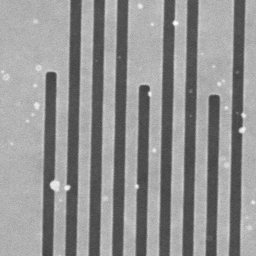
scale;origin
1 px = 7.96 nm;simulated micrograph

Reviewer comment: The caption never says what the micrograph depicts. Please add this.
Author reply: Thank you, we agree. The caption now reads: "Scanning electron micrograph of groups of lines, slits or small figures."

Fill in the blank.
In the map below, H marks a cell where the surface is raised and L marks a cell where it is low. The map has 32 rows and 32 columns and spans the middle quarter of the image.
HLLLHHHLLLHHHLLLHHHHHHHHHLLLHHLL
HLLLHHHLLLHHHLLLHHHHHHHHLLLLHHLL
HLLLHHHLLLHHHLLLHHHHHHHHLLLLHHLL
HLLLHHHLLLHHHLLLHHHHHHHHLLLLHHLL
HLLLHHHLLLHHHLLLHHHHHHHHLLLLHHLL
HLLLHHHLLLHHHLLLHHHLLHHHLLLLHHLL
HLLLHHHLLLHHHLLLHHLLLLHHLLLLHHLL
HLLLHHHLLLHHHLLLHHLLLHHHLLLLHHLL
HLLLHHHLLLHHHLLLHHLLLLHHLLLHHHLL
HLLLHHHLLLHHHLLLHHLLLLHHLLLHHHLL
HLLLHHHLLLHHHLLLHHLLLHHHLLLHHHLL
HLLLHHHLLLHHHLLLHHLLLHHHLLLHHHLL
HLLLHHHLLLHHHLLLHHLLLHHHLLLHHHLL
HLLLHHHLLLHHHLLLHHLLLHHHLLLHHHLL
HLLLHHHLLLHHHLLLHHLLLHHHLLLHHHLL
HLLLHHHLLLHHHLLLHHLLLHHHLLLHHHLL
HLLLHHHLLLHHHLLLHHLLLHHHLLLHHHLL
HLLLHHHLLLHHHLLLHHLLLHHHLLLHHHLL
HLLLHHHLLLHHHLLLHHLLLHHHLLLHHHLL
HLLLHHHLLLHHHLLLHHLLLHHHLLLHHHLL
HLLLHHHLLLHHLLLLHHLLLHHHLLLHHHLL
HLLLHHHLLLHHLLLLHHLLLHHHLLLHHHLL
HLLLHHHLLLHHLLLLHHLLLHHHLLLHHHLL
HLLLHHHLLLHHLLLLHHLLLHHHLLLHHHLL
HLLLHHLLLLHHLLLLHHLLLHHHLLLHHHLL
HLLLHHLLLLHHLLLHHHLLLHHHLLLHHHLL
HLLLHHLLLLHHLLLHHHLLLHHHLLLHHHLL
LLLLHHLLLLHHLLLHHHLLLHHHLLLHHHLL
LLLLHHLLLLHHLLLHHHLLLHHHLLLHHHLL
LLLLHHLLLLHHLLLHHHLLLHHHLLLHHHLL
HLLLHHLLLLHHLLLHHHLLLHHHLLLHHHLL
HLLLHHLLLHHHLLLHHHLLLHHHLLLHHHLL